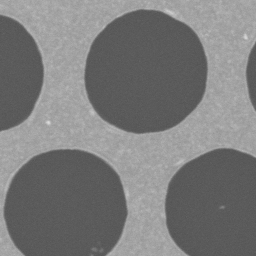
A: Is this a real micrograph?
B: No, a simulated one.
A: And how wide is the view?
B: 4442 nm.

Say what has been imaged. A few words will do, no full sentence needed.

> holes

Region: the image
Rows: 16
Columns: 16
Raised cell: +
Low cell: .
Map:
++++++++++++++++
.++++++.....++++
..++++.......+++
...++........+++
...++........++.
...++........++.
..++++......++++
..++++.....+++++
++++++++++++++++
+++...+++++++..+
+......++++.....
+.......+++.....
........++......
........++......
........+++.....
+......++++.....